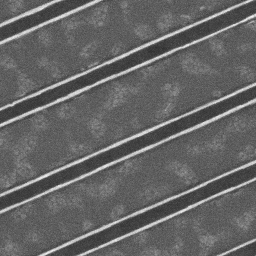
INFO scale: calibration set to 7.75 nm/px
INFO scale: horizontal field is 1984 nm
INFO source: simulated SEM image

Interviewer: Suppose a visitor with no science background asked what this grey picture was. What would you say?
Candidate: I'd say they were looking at one or a few lines or trenches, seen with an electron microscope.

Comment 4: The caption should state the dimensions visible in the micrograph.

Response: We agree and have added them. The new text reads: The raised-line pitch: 0.589 micrometres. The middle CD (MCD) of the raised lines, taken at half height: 126 nanometres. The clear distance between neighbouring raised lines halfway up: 468 nanometres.